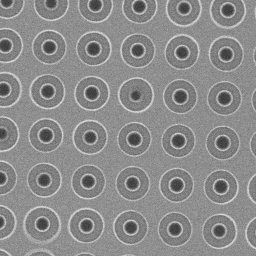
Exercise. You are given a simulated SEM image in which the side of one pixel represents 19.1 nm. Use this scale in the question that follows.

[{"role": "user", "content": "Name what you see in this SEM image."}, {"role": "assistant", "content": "an array of small figures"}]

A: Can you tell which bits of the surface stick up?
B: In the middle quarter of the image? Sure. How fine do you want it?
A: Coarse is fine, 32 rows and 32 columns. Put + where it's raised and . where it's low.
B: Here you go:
+++++++++++++++++...+++++++.....
++++++++++++++++++++++++++++++++
++++++++++++++++++++++++++++++++
+++++....+++++++++++++++++++++++
++++......+++++......++++++....+
+++...++...+++........++++......
+++..++++..+++...++...+++...++..
+++..++++..+++..+++...+++..++++.
+++..+++...+++..+++...+++..++++.
+++........+++........+++...+++.
++++......+++++......+++++......
+++++++.++++++++....+++++++....+
++++++++++++++++++++++++++++++++
++++++++++++++++++++++++++++++++
+++++...++++++++++++++++++++++++
+++.......+++++.....+++++++...++
+++.......++++.......+++++......
++...+++...+++..+++...+++...+...
++...+++...++...+++...+++..+++..
++...+++...+++..+++...++...++++.
+++.......++++...++..++++..+++..
++++.....+++++.......++++.......
++++++.+++++++++...+++++++.....+
++++++++++++++++++++++++++++++++
++++++++++++++++++++++++++++++++
+++++..+++++++++++++++++++++++++
+++......++++++.....+++++++...++
++........++++.......++++......+
++..++++..+++...++...+++...++...
++..++++..+++..++++..+++...+++..
++...+++..+++..++++..+++..++++..
++........+++...++...+++...+++..